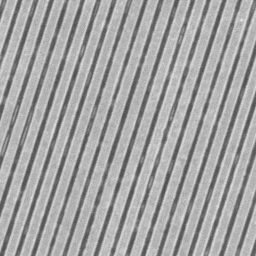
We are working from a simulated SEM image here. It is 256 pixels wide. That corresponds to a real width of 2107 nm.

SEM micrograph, parallel lines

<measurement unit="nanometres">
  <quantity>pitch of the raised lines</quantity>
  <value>123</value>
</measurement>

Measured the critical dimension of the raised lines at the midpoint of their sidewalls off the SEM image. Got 8.46 px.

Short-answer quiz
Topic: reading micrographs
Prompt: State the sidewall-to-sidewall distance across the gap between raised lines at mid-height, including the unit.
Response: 49 nanometers